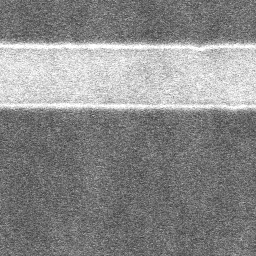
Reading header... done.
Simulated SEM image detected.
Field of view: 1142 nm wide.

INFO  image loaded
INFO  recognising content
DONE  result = one or a few lines or trenches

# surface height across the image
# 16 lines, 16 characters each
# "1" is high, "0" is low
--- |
1111111111111111
1111111111111111
1111111111111111
0000000000000000
0000000000000000
0000000000000000
0000000000000000
1111111111111111
1111111111111111
1111111111111111
1111111111111111
1111111111111111
1111111111111111
1111111111111111
1111111111111111
1111111111111111